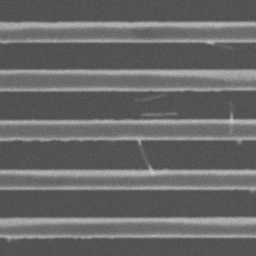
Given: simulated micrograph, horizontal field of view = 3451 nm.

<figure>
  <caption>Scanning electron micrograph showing lines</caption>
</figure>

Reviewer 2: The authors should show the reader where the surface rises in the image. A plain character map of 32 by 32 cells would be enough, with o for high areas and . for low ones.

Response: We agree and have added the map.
................................
................................
................................
oooooooooooooooooooooooooooooooo
oooooooooooooooooooooooooooooooo
................................
................................
................................
................................
oooooooooooooooooooooooooooooooo
oooooooooooooooooooooooooooooooo
................................
................................
................................
................................
oooooooooooooooooooooooooooooooo
oooooooooooooooooooooooooooooooo
oooo.oooo........o..............
................................
................................
................................
oooo..............oooooooooooooo
oooooooooooooooooooooooooooooooo
oooooooooooooooooooooooooooooooo
................................
................................
................................
.........oooooooooooooooo......o
oooooooooooooooooooooooooooooooo
oooooooooooooooooooooooooooooooo
................................
................................